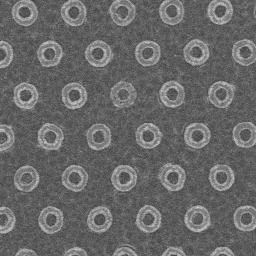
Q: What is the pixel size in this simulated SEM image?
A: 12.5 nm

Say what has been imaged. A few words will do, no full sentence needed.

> a regular array of ring-shaped raised bodies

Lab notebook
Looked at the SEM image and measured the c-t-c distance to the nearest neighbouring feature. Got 595 nanometres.